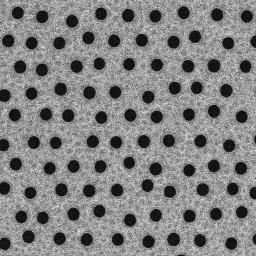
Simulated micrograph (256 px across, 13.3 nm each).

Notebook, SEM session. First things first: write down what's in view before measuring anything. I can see a regular array of holes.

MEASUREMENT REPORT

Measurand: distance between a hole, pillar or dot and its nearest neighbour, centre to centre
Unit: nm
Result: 330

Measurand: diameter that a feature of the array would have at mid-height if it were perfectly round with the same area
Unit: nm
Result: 166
